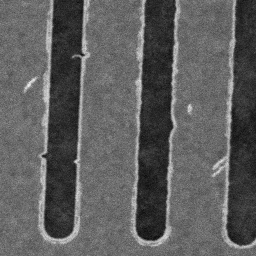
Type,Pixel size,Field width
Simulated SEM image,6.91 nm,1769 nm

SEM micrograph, one or a few lines or trenches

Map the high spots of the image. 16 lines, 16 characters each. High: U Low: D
UUUDDUUUUDDUUUUD
UUUDDUUUUDDUUUUD
UUUDDUUUUDDUUUUD
UUUDDUUUUDDUUUUD
UUUDDUUUUDDUUUUD
UUUDDUUUUDDUUUDD
UUUDDUUUUDDUUUDD
UUUDDUUUUDDUUUDD
UUUDDUUUUDDUUUDD
UUUDDUUUUDDUUUDD
UUUDDUUUUDDUUUDD
UUUDDUUUUDDUUUDD
UUUDDUUUDDDUUUDD
UUUDDUUUDDUUUUDD
UUUDDUUUDDUUUUDD
UUUUUUUUUUUUUUUU